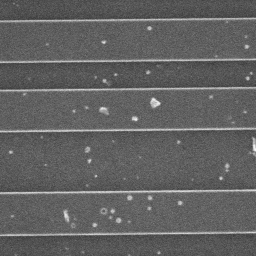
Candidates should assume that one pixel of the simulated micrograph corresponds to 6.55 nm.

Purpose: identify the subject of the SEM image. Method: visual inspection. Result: groups of lines, slits or small figures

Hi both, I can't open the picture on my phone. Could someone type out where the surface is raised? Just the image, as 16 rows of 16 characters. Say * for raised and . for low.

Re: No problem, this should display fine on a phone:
................
****************
****************
****************
................
.............***
****************
****************
................
................
................
................
****************
****************
****************
................